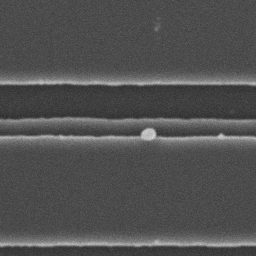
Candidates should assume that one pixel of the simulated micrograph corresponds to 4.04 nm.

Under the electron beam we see lines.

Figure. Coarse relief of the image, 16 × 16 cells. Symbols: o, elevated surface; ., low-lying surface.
oooooooooooooooo
oooooooooooooooo
oooooooooooooooo
oooooooooooooooo
oooooooooooooooo
................
................
................
..ooo...oo...o..
oooooooooooooooo
oooooooooooooooo
oooooooooooooooo
oooooooooooooooo
oooooooooooooooo
oooooooooooooooo
................